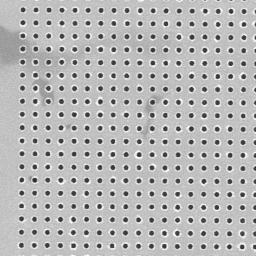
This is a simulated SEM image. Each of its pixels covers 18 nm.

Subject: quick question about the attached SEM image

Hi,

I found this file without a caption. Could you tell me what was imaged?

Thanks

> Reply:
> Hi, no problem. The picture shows a regular array of holes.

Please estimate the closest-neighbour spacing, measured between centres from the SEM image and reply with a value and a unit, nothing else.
12.8 pixels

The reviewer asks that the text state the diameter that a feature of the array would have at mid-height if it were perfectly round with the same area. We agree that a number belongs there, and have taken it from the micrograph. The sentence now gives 97.2 nm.